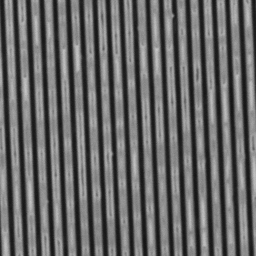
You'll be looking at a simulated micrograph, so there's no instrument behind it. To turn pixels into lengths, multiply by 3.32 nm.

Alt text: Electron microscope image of parallel lines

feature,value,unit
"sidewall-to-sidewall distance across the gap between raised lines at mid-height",0.017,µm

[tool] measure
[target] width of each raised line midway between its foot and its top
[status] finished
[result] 25.7 nanometres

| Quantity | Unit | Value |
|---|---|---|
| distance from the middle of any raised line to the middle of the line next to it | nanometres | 43.9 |